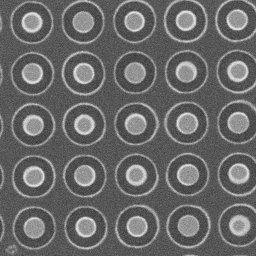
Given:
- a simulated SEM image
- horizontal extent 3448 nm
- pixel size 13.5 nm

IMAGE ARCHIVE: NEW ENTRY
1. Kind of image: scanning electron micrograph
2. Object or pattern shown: an array of small figures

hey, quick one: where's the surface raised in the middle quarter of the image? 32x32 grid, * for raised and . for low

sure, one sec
...****...***...***....***...***
...****...***..*****...**...****
...****...***..*****...**...****
...****...***..*****...***...***
....**....***...***...****......
*........*****........*****.....
**......*******.....********....
****..**************************
********************************
********************************
***....********......*******....
*........*****........*****.....
*........****..........***......
....**....***...****...**....***
...****...***...****....*...****
...****...***...****....*...****
...****...***...****...***...***
*.........***..........***......
*........*****........*****.....
**......*******......********...
********************************
********************************
******************************..
**......*******......*******....
*........*****........*****.....
*...**....****.........***....**
...****...***....***...***...***
...****...***...****...***...***
...****...***...****...***...***
...****...***....**....***...***
*.........****.........***......
*........*****........*****.....